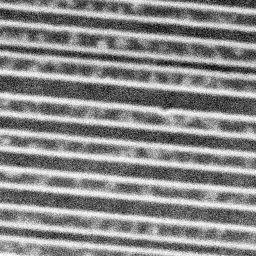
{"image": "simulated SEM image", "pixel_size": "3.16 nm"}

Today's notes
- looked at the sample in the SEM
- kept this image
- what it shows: parallel lines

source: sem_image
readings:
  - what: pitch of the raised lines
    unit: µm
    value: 0.115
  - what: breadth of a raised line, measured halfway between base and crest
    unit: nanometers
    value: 58.1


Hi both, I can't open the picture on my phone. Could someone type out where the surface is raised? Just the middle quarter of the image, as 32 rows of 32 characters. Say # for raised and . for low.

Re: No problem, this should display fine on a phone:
#################...............
##############################..
################################
################################
............####################
.....................###########
................................
................................
................................
##..............................
###############.................
#######################.........
################################
################################
......#.########################
.................###############
.............................###
................................
##..............................
#############...................
########################........
################################
################################
..........######################
.....................###########
..............................##
................................
#...............................
############....................
#######################.........
###############################.
################################